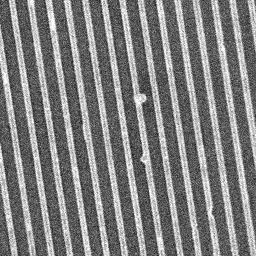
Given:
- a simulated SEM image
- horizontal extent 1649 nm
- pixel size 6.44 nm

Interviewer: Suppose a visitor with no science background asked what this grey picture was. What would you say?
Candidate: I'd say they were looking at parallel lines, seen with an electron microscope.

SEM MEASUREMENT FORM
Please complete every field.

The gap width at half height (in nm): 80.4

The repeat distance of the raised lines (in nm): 117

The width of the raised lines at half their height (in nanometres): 36.6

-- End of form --